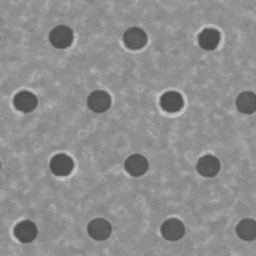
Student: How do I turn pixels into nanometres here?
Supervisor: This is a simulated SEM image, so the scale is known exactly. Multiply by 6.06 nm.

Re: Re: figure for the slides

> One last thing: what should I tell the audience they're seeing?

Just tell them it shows a regular array of holes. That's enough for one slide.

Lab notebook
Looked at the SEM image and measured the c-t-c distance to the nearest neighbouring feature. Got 442 nm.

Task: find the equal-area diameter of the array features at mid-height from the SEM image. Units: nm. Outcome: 149